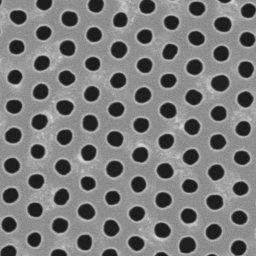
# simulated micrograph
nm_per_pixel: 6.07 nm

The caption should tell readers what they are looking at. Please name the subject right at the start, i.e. a regular array of holes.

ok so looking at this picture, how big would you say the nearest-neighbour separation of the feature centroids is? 176 nm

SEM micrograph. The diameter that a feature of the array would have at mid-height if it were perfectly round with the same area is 95.1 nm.